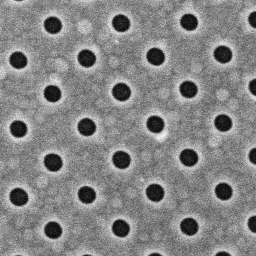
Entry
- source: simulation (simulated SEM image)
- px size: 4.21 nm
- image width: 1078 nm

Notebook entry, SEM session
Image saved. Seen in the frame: a regular array of holes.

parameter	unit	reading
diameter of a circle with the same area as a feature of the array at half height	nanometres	77.4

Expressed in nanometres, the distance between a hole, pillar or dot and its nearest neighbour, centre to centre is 199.